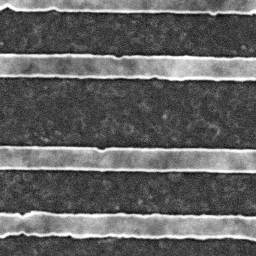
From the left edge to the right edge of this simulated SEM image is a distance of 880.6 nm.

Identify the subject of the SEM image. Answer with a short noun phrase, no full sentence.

one or a few lines or trenches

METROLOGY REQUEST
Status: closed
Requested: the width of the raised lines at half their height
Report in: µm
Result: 0.0717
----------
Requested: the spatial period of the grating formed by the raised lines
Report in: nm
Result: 273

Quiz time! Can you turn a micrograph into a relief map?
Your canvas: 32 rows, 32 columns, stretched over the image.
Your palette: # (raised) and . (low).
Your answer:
################################
......................##########
................................
................................
................................
................................
................................
################################
################################
.###....########################
................................
................................
................................
................................
................................
................................
................................
................................
##.######.......................
################################
################################
................................
................................
................................
................................
................................
................................
################################
################################
#........##.#..#################
................................
................................